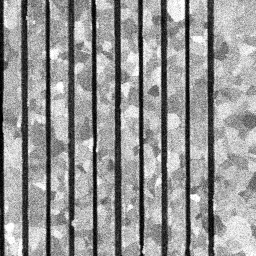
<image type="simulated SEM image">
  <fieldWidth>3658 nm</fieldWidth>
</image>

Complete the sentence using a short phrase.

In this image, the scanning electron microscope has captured parallel lines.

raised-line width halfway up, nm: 252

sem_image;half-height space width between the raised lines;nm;82.2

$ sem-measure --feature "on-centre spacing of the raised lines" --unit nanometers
332